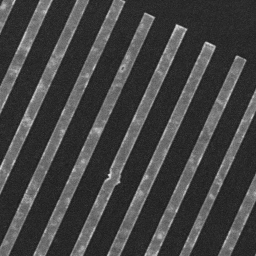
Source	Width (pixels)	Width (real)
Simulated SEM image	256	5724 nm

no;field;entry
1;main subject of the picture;parallel lines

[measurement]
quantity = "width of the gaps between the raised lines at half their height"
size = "506 nm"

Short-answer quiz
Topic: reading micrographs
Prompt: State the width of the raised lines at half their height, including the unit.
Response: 244 nanometers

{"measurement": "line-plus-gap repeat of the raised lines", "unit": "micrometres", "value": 0.745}